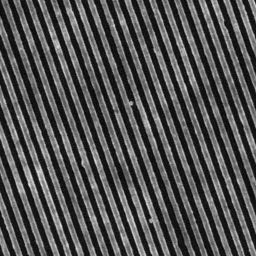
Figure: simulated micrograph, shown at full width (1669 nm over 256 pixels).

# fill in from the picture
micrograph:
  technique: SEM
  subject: parallel lines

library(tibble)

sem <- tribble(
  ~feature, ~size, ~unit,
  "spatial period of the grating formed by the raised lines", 76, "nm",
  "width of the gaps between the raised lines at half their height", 0.0439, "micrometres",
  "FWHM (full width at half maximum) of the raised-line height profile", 33.1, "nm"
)